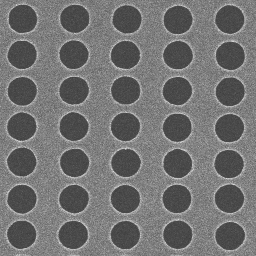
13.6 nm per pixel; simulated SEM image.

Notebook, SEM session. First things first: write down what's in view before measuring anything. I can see a regular array of holes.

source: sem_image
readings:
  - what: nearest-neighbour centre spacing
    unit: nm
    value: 486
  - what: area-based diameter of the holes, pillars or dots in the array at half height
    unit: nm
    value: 389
